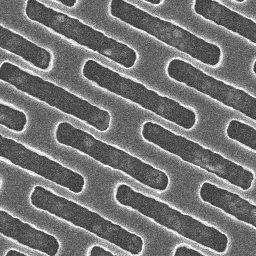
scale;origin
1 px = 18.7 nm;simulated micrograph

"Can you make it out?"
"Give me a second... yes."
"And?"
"holes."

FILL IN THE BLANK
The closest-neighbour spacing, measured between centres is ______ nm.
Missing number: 1270